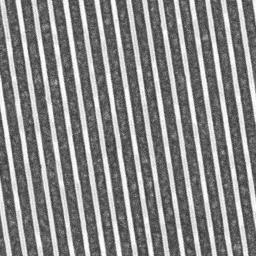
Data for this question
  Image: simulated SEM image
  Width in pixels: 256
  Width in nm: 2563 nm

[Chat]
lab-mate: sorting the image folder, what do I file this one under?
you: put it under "parallel lines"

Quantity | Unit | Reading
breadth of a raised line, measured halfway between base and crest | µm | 0.0347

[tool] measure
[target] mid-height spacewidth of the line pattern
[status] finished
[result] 121 nanometers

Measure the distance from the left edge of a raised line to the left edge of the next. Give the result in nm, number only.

156